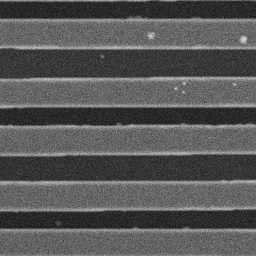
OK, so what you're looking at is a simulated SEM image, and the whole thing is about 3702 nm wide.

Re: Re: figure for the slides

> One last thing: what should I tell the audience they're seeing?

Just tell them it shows lines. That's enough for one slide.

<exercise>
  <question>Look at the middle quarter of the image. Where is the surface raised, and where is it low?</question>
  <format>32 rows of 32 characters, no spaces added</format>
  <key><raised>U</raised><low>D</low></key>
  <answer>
DDDDDDDDDDDDDDDDDDDDDDDDDDDDDDDD
DDDDDDDDDDDDDDDDDDDDDDDDDDDDDDDD
DDDDDDDDDDDDDDDDDDDDDDDDDDDDDDDD
DDDDDDDDDDDDDDDDDDDDDDUUUUUUUUUU
UUUUUUUUUUUUUUUUUUUUUUUUUUUUUUUU
UUUUUUUUUUUUUUUUUUUUUUUUUUUUUUUU
UUUUUUUUUUUUUUUUUUUUUUUUUUUUUUUU
UUUUUUUUUUUUUUUUUUUUUUUUUUUUUUUU
UUUUUUUUUUUUUUUUUUUUUUUUUUUUUUUU
UUUUUUUUUUUUUUUUUUUUUUUUUUUUUUUU
UUUUUUUUUUUUUUUUUUUUUUUUUUUUUUUU
DDDDDDDDDDDDDDDDDDDDDDDDDDDDDDDD
DDDDDDDDDDDDDDDDDDDDDDDDDDDDDDDD
DDDDDDDDDDDDDDDDDDDDDDDDDDDDDDDD
DDDDDDDDDDDDDDDDDDDDDDDDDDDDDDDD
UUUDUDUDDDDDDDDUUUUUUUUUUUUUUUUU
UUUUUUUUUUUUUUUUUUUUUUUUUUUUUUUU
UUUUUUUUUUUUUUUUUUUUUUUUUUUUUUUU
UUUUUUUUUUUUUUUUUUUUUUUUUUUUUUUU
UUUUUUUUUUUUUUUUUUUUUUUUUUUUUUUU
UUUUUUUUUUUUUUUUUUUUUUUUUUUUUUUU
UUUUUUUUUUUUUUUUUUUUUUUUUUUUUUUU
UUUUUUUUUUUUUUUUUUUUUUUUUUUUUUUU
DDDDDDDDDDDDDDDDDDDDDDDDDDDDDDDD
DDDDDDDDDDDDDDDDDDDDDDDDDDDDDDDD
DDDDDDDDDDDDDDDDDDDDDDDDDDDDDDDD
DDDDDDDDDDDDDDDDDDDDDDDDDDDDDDDD
DDDDDDDDDDDDDDDDDDDDDDDDDDDDDDDD
DDDDDDDDDDDDDDDDDDDDDDDDDDDDDDDD
UUUUUUUUUUUUUUUUUUUUUUUUUUUUUUUU
UUUUUUUUUUUUUUUUUUUUUUUUUUUUUUUU
UUUUUUUUUUUUUUUUUUUUUUUUUUUUUUUU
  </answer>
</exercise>